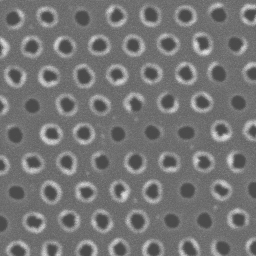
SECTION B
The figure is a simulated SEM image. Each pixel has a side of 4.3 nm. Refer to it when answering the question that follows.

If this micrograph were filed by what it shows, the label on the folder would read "a regular array of holes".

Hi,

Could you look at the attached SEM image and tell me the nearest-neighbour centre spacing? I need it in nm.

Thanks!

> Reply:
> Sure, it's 142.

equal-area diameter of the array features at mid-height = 57.7 nanometers